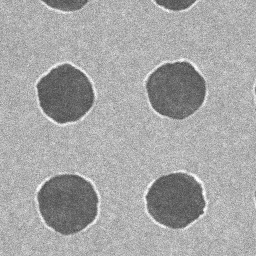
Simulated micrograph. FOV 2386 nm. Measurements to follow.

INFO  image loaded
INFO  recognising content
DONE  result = holes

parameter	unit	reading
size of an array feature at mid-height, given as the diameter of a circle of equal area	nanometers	537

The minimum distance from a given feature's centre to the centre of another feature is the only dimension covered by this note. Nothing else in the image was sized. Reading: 1010 nm